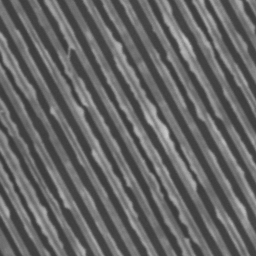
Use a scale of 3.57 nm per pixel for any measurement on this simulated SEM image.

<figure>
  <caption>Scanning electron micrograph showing parallel lines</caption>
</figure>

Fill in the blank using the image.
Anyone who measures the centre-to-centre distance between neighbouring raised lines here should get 57.1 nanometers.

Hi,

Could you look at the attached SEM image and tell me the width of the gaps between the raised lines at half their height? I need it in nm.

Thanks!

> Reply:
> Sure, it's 25.8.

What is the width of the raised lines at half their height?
0.0317 um